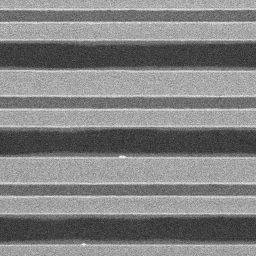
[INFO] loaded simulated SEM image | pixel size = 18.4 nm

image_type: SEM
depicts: lines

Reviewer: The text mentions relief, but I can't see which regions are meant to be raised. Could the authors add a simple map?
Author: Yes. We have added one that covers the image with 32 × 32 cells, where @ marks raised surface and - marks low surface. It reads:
@@@@@@@@@@@@@@@@@@@@@@@@@@@@@@@@
@@@@@@@@@@@@@@@@@@@@@@@@@@@@@@@@
@@@@@@@@@@@@@@@@@@@@@@@@@@@@@@@@
@@@@@@@@@@@@@@@@@@@@@@@@@@@@@@@@
@@@@@@@@@@@@@@@@@@@@@@@@@@@@@@@@
--------------------------------
--------------------------------
--------------------------------
--------------------------------
@@@@@@@@@@@@@@@@@@@@@@@@@@@@@@@@
@@@@@@@@@@@@@@@@@@@@@@@@@@@@@@@@
@@@@@@@@@@@@@@@@@@@@@@@@@@@@@@@@
@@@@@@@@@@@@@@@@@@@@@@@@@@@@@@@@
@@@@@@@@@@@@@@@@@@@@@@@@@@@@@@@@
@@@@@@@@@@@@@@@@@@@@@@@@@@@@@@@@
@@@@@@@@@@@@@@@@@@@@@@@@@@@@@@@@
--------------------------------
--------------------------------
--------------------------------
--------------------------------
@@@@@@@@@@@@@@@@@@@@@@@@@@@@@@@@
@@@@@@@@@@@@@@@@@@@@@@@@@@@@@@@@
@@@@@@@@@@@@@@@@@@@@@@@@@@@@@@@@
@@@@@@@@@@@@@@@@@@@@@@@@@@@@@@@@
@@@@@@@@@@@@@@@@@@@@@@@@@@@@@@@@
@@@@@@@@@@@@@@@@@@@@@@@@@@@@@@@@
@@@@@@@@@@@@@@@@@@@@@@@@@@@@@@@@
--------------------------------
--------------------------------
--------------------------------
----------@---------------------
@@@@@@@@@@@@@@@@@@@@@@@@@@@@@@@@